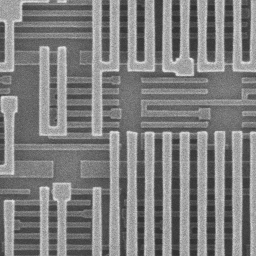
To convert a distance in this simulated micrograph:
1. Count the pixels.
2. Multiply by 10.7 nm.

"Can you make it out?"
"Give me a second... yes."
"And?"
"wiring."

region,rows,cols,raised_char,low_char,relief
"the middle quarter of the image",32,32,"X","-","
-------XXXXXXX--XXXXXXX--XXXXXXX
-------XXXXXXX--XXXXXXX--XXXXXXX
-------XX-------------------XXXX
-------XX-----------------------
-------XX-----------------------
-------XX-----------------------
-------XX-----------------------
-------XX-----------------------
-------XX-----------------------
-------XX-----------------------
-------XX-----------------------
-------XX-----------------------
-------XX-----------------------
-------XX-----------------------
-------XX-----------------------
-------XX-----------------------
-------XX-----------------------
-------XX---XX--XX--XXX--XX--XX-
------------XX--XX--XXX--XX--XX-
------------XX--XX--XXX--XX--XX-
------------XX--XX--XXX--XX--XX-
------------XX--XX--XXX--XX--XX-
------------XX--XX--XXX--XX--XX-
------------XX--XX--XXX--XX--XX-
------------XX--XX--XXX--XX--XX-
------------XX--XX--XXX--XX--XX-
------------XX--XX--XXX--XX--XX-
------------XX--XX--XX---XX--XX-
------------XX--XX--XX---XX--XX-
------------XX--XX--XX---XX--XX-
XX----------XX--XX--XX---XX--XX-
XX-----XX---XX--XX--XX---XX--XX-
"